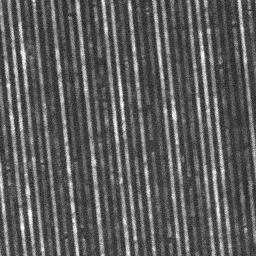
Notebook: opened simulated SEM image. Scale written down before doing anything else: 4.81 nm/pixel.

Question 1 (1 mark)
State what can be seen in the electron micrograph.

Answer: parallel lines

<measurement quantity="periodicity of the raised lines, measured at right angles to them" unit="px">8.52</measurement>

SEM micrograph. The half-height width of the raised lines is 2.74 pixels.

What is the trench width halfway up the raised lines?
0.0293 micrometres